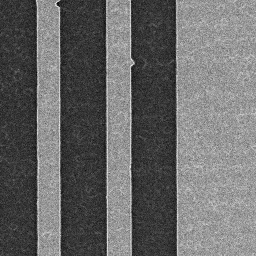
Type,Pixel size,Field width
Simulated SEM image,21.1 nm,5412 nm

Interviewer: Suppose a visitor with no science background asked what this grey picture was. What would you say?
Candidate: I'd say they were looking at one or a few lines or trenches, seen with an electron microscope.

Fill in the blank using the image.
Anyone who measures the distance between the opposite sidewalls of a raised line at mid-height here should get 481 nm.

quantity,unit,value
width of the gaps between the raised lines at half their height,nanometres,983